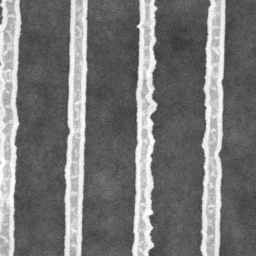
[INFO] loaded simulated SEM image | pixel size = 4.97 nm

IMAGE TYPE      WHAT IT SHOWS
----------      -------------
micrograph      one or a few lines or trenches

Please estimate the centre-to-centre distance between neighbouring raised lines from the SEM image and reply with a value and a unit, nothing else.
341 nanometres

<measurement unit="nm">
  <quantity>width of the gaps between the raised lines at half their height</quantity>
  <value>279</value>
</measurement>